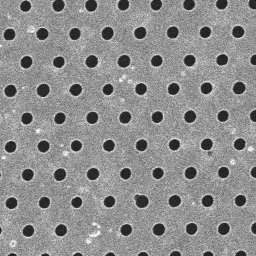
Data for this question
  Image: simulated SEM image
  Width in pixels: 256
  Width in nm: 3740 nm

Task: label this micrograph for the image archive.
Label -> a regular array of holes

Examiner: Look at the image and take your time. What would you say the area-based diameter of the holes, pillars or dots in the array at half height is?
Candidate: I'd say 11.7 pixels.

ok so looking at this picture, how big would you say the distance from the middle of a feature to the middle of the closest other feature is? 470 nm